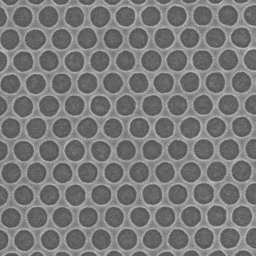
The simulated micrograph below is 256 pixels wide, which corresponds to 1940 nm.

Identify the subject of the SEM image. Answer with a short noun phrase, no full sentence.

a regular array of holes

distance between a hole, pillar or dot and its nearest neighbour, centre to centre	0.192	um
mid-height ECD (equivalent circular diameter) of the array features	0.156	microns